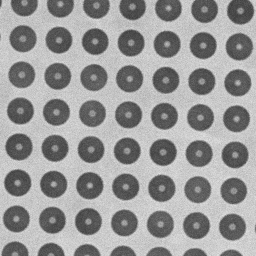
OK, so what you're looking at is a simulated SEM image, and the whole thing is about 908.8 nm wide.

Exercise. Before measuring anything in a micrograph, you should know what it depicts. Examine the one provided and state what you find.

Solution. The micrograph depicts an array of small figures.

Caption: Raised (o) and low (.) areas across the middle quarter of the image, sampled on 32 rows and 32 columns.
.oooo....oooooo...ooooooo.oooooo
.oooo.....oooo.....oooo.....oooo
..oo.......oo.......oo......oooo
..oo.......oo.......oo.......oo.
..oo.......oo.......oo.......oo.
.oooo.....ooo......ooo.......oo.
oooooo...ooooo....ooooo.....oooo
oooooooooooooooooooooooooooooooo
oooooooooooooooooooooooooooooooo
ooooo....oooooo..ooooooooooooooo
.ooo......oooo.....oooo....ooooo
..oo.......oo......ooo......ooo.
.ooo.......oo.......oo......ooo.
.ooo......ooo......ooo......ooo.
.ooo......ooo......ooo......ooo.
oooooo...ooooo....ooooo.....ooo.
oooooooooooooooooooooooooooooooo
oooooooooooooooooooooooooooooooo
ooooo....oooooo..ooooooooooooooo
.ooo.....oooo.....oooo.....ooooo
.oo.......ooo......ooo......ooo.
.oo.......oo.......oo.......oo..
.ooo......ooo......oo.......oo..
oooo......ooo......ooo......ooo.
oooooo..oooooo....oooo.....oooo.
oooooooooooooooooooooooo.ooooooo
oooooooooooooooooooooooooooooooo
oooo....ooooooo.oooooooo.ooooooo
oooo.....oooo.....oooo.....ooooo
.oo.......oo.......oo.......ooo.
.oo.......oo.......oo.......oo..
.oo.......oo.......oo.......oo..